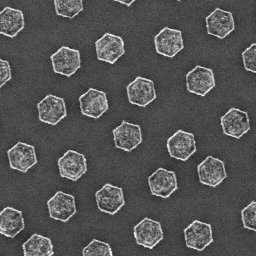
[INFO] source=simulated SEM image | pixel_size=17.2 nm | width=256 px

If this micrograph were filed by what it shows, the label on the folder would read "a regular array of raised bodies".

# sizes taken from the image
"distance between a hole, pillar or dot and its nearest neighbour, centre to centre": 804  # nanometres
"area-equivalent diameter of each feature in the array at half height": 27.3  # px